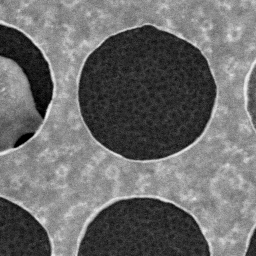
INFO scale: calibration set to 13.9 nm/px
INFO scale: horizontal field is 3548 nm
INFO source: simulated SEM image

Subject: holes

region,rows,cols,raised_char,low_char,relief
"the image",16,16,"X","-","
XXXXXXXXXXXXXXXX
XXXXXXXXXXXXXXXX
--XXXXX----XXXXX
---XXX-------XXX
---XX--------XXX
X--XX---------X-
---XX--------XX-
---XX--------XXX
--XXXX-------XXX
XXXXXXX----XXXXX
XXXXXXXXXXXXXXXX
XXXXXXXXXXXXXXXX
XXXXXXX---XXXXXX
--XXXX------XXXX
---XX--------XXX
---XX--------XX-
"